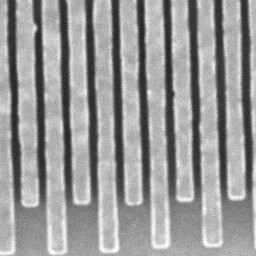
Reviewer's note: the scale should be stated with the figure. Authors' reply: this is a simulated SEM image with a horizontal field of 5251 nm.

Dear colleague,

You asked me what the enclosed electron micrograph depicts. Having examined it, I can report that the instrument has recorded parallel lines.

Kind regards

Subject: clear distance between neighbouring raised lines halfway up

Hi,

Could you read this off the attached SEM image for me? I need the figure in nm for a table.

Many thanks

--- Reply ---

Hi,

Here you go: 184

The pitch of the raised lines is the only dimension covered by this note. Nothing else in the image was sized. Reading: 0.53 um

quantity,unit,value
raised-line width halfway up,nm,348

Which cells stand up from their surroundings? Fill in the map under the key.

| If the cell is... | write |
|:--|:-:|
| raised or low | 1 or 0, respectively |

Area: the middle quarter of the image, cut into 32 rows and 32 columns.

00111000111100111100011110011110
00111100111100111100011110011110
00111100111100011100011110011110
00111100111100011100011110001110
00111100111100011100011110011110
00111100111100011100011110011110
00111100111100011100011110001110
00111100111100011100011110001110
00111100111100011100011110001110
00111100111100011110011110001110
00111100111100011110011110001111
00111100111100011110011110001111
00111100011100011110011110001111
00111100011100011110011110001111
00111100011100011110011110001111
00111100011100011110011110001111
00111100011100011110011110001111
00111100011100011110011110001111
00111100011100011110011110001111
00111100011100011110011111001111
00111100011110011110001111001111
00111100011100011110001110001111
00111100011110011110001110001111
00111100011110011110001110001111
00111100011110011110001110001111
00111100011110011110001110001111
00111100011110011110001110001111
00111100011110011110001111001111
00111100011110011110001111001111
00111100011110011110001111001111
00111100011110011110001111001111
00111100011110011110001111001111